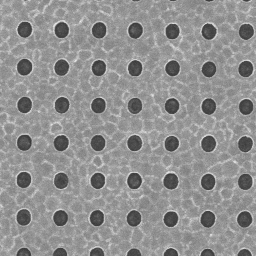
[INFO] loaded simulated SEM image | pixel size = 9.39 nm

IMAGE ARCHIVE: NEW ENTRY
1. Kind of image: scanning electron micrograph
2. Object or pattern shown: a regular array of holes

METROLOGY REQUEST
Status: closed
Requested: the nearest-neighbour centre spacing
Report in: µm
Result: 0.344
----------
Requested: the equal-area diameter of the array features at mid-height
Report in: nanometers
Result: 148